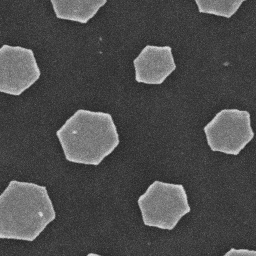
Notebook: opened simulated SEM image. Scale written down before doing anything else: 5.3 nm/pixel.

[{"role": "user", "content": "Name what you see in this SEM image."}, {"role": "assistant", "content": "raised bodies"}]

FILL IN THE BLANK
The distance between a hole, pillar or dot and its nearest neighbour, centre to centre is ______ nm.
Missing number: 524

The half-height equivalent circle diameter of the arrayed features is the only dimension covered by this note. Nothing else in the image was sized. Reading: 245 nm